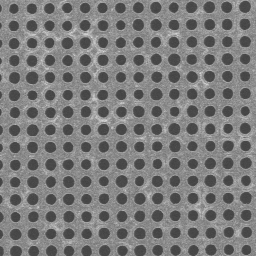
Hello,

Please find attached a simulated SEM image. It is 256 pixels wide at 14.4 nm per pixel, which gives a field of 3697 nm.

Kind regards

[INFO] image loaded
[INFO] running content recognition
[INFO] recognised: a regular array of holes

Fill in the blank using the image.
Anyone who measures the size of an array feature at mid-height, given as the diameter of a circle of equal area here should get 160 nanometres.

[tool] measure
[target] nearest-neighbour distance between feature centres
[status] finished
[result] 248 nm